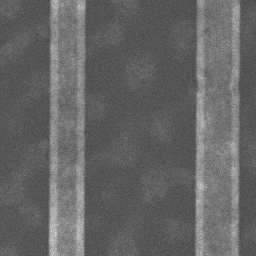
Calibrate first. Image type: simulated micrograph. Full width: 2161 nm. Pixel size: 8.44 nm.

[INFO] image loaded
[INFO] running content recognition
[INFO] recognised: one or a few lines or trenches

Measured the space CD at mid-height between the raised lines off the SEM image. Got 1.01 microns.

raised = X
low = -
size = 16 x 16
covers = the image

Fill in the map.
---XX--------XX-
---XX--------XX-
---XX--------XX-
---XX--------XX-
---XX--------XX-
---XX--------XX-
---XX--------XX-
---XX--------XX-
---XX--------XX-
---XX--------XX-
---XX--------XX-
---XX--------XX-
---XX--------XX-
---XX--------XX-
---XX--------XX-
---XX--------XX-